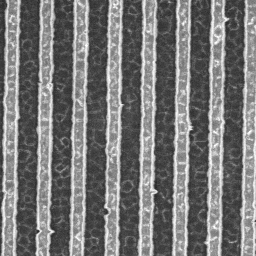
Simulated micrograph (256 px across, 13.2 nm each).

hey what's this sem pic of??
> parallel lines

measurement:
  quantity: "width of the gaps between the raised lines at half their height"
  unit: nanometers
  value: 279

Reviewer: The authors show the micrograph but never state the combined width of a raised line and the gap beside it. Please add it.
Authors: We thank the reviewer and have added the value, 453 nm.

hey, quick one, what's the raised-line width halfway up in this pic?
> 0.167 micrometres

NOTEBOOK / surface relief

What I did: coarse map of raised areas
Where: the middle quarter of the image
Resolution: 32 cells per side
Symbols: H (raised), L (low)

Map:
LLLHHHLLLLLHHHLLLLLLHHHLLLLLHHHL
LLLHHLLLLLLHHHLLLLLLHHHLLLLLHHHL
LLLHHLLLLLLHHHLLLLLLHHHLLLLLHHHL
LLHHHHLLLLLHHHLLLLLLHHHLLLLLHHHL
LLHHHHLLLLLHHHLLLLLLHHHLLLLLHHHL
LLHHHLLLLLLHHHLLLLLHHHHLLLLLHHHL
LLHHHLLLLLLHHHLLLLLHHHHLLLLLHHHL
LLHHHLLLLLLHHHLLLLLLHHLLLLLLHHHL
LLHHHLLLLLLHHHLLLLLLHHHLLLLLHHHL
LLLHHLLLLLLHHHLLLLLLHHLLLLLLHHHL
LLHHHLLLLLLHHHLLLLLLHHLLLLLLHHHL
LLHHHHLLLLLHHHLLLLLLHHHLLLLLHHHL
LLHHHHLLLLLHHHLLLLLLHHLLLLLLHHHL
LLHHHLLLLLLHHHLLLLLHHHLLLLLLHHHL
LLHHHLLLLLLHHHLLLLLHHHLLLLLLHHHL
LLHHHLLLLLLHHHLLLLLHHHLLLLLLHHHH
LLHHHLLLLLLHHHLLLLLHHHLLLLLLHHHH
LLHHHLLLLLLHHHLLLLLHHHLLLLLLHHHL
LLHHHLLLLLLHHHLLLLLHHHLLLLLLHHHL
LLHHHLLLLLLHHHLLLLLHHHLLLLLLHHHL
LLHHHLLLLLLHHHLLLLLLHHLLLLLLHHHL
LLHHHLLLLLLHHHLLLLLLHHLLLLLLHHHL
LLHHHLLLLLLHHHLLLLLHHHLLLLLLHHHL
LLHHHLLLLLLHHHLLLLLHHHLLLLLLHHHL
LLHHHLLLLLLHHHLLLLLHHHLLLLLLHHHL
LLHHHLLLLLLHHHLLLLLHHHLLLLLLHHHL
LLHHHLLLLLLHHHLLLLLHHHLLLLLLHHHL
LLHHHLLLLLLHHHLLLLLHHHLLLLLLHHHL
LLHHHLLLLLLHHHLLLLLHHHLLLLLLHHHL
LLHHHLLLLLLHHHLLLLLHHHLLLLLLHHHL
LLHHHLLLLLLHHHLLLLLHHHLLLLLLHHHL
LLHHHLLLLLLHHHLLLLLHHHHLLLLLHHHL